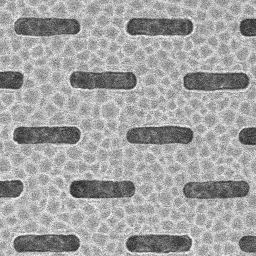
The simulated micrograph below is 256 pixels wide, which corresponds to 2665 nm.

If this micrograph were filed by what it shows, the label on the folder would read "a regular array of holes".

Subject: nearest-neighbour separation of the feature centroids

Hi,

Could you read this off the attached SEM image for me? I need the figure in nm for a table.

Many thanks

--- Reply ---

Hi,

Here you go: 805